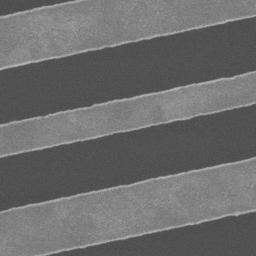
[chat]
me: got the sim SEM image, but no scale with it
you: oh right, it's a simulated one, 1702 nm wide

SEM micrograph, lines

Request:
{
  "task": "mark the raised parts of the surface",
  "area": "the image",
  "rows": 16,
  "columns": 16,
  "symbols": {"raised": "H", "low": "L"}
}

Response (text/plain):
LLHHHHHHHHHHHHHH
HHHHHHHHHHHHHHLL
HHHHHHHHHLLLLLLL
HHHHLLLLLLLLLLLL
LLLLLLLLLLLLLLLL
LLLLLLLLLLLHHHHH
LLLLLLHHHHHHHHHH
LLHHHHHHHHHLLLLL
HHHHHHHLLLLLLLLL
HHLLLLLLLLLLLLLL
LLLLLLLLLLLLLHHH
LLLLLLLLHHHHHHHH
LLLHHHHHHHHHHHHH
HHHHHHHHHHHHHHLL
HHHHHHHHHHLLLLLL
HHHHHLLLLLLLLLLL